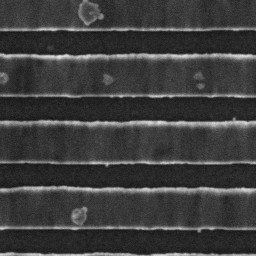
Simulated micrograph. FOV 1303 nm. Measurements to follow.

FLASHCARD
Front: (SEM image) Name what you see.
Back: lines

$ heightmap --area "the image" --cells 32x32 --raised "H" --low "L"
HHHHHHHHHHHHHHHHHHHHHHHHHHHHHHHH
HHHHHHHHHHHHHHHHHHHHHHHHHHHHHHHH
HHHHHHHHHHHHHHHHHHHHHHHHHHHHHHHH
HHHHHHHHHHHHHHHHHHHHHHHHHHHHHHHH
LLLLLLLLLLLLLLLLLLLLLLLLLLLLLLLL
LLLLLLLLLLLLLLLLLLLLLLLLLLLLLLLL
LLLLLLLLLLLLLLLLLLLLLLLLLLLLLLLL
HHHHHHHHHHHHHHHHHHHHHHHHHHHHHHHH
HHHHHHHHHHHHHHHHHHHHHHHHHHHHHHHH
HHHHHHHHHHHHHHHHHHHHHHHHHHHHHHHH
HHHHHHHHHHHHHHHHHHHHHHHHHHHHHHHH
HHHHHHHHHHHHHHHHHHHHHHHHHHHHHHHH
LLLLLLLLLLLLLLLLLLLLLLLLLLLLLLLL
LLLLLLLLLLLLLLLLLLLLLLLLLLLLLLLL
LLLLLLLLLLLLLLLLLLLLLLLLLLLLLLLL
HHHHHHHHHHHHHHHHHHHHHHHHHHHHHHHH
HHHHHHHHHHHHHHHHHHHHHHHHHHHHHHHH
HHHHHHHHHHHHHHHHHHHHHHHHHHHHHHHH
HHHHHHHHHHHHHHHHHHHHHHHHHHHHHHHH
HHHHHHHHHHHHHHHHHHHHHHHHHHHHHHHH
LLLLLLLLLLLLLLLLLLLLLLLLLLLLLLLL
LLLLLLLLLLLLLLLLLLLLLLLLLLLLLLLL
LLLLLLLLLLLLLLLLLLLLLLLLLLLLLLLL
LLLLLHHHHLLLLLLLLLLLLLLLLLLLLLLL
HHHHHHHHHHHHHHHHHHHHHHHHHHHHHHHH
HHHHHHHHHHHHHHHHHHHHHHHHHHHHHHHH
HHHHHHHHHHHHHHHHHHHHHHHHHHHHHHHH
HHHHHHHHHHHHHHHHHHHHHHHHHHHHHHHH
HHHHHHHHHHHHHHHHHHHHHHHHHHHHHHHH
LLLLLLLLLLLLLLLLLLLLLLLLLLLLLLLL
LLLLLLLLLLLLLLLLLLLLLLLLLLLLLLLL
LLLLLLLLLLLLLLLLLLLLLLLLLLLLLLLL